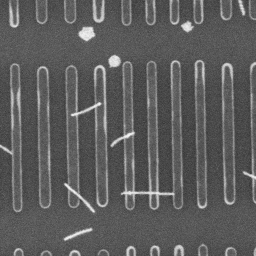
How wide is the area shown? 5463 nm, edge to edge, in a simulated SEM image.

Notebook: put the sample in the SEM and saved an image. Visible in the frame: groups of lines, slits or small figures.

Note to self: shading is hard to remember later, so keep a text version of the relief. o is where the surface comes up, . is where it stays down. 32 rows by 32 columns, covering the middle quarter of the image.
...............oo....oo....oo...
.oo.....oo.....oo....oo....oo...
.oo.....oo.....oo....oo....oo...
.oo.....oo.....oo....oo....oo...
.oo.....oo.....oo....oo....oo...
.oo.....oo.....oo....oo....oo...
.oo.....oo.....oo....oo....oo...
.oo.....oo.....oo....oo....oo...
.oo.....oo.....oo....oo....oo...
.oo.....oo.....oo....oo....oo...
.oo....ooo.....oo....oo....oo...
.oo.....oo.....oo....oo....oo...
.ooo....oo.....oo....oo....oo...
.oo.....oo.....oo....oo....oo...
.oo.....oo.....oo....oo....oo...
.oo.....oo.....oo....oo....oo...
.oo.....oo.....oo....oo....oo...
.oo.....ooo....oo....oo....oo...
.oo.....ooo....oo....oo....oo...
.oo.....ooo....oo....oo....oo...
.oo.....ooo....oo....oo....oo...
.oo.....ooo....oo....oo....oo...
.oo.....ooo....oo....oo....oo...
.oo.....ooo....oo....oo....oo...
.oo.....ooo....oo....oo....oo...
.ooo....ooo....oo....oo....oo...
.ooo....ooo....oo....oo....oo...
.ooo....ooo....oo....oo....oo...
.ooo....ooo....oo....oo....oo...
.ooo....ooo....oo.....o....oo...
.ooo....ooo....oo.....o....oo...
.ooo....ooo....oo.....o....oo...